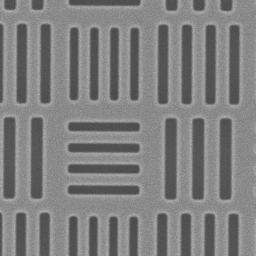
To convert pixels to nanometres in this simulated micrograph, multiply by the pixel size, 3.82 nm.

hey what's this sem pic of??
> groups of lines, slits or small figures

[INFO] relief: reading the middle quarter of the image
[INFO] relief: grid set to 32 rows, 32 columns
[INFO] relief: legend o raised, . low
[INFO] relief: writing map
o...oo...oo...oo...oooo...ooo...
o...oo...oo...oo...oooo...ooo...
o...oo...oo...oo...oooo...ooo...
o...oo...oo...oo...oooo...ooo...
o...oo...oo...oo...oooo...ooo...
o...oo...oo...oo...oooo...ooo...
o...oo...oo...oo...oooo...ooo...
o...oo...oo...oo...oooo...ooo...
o...oo..ooo...oo...oooo...ooo...
ooooooooooooooooooooooo...ooo...
oooooooooooooooooooooooooooooooo
oooooooooooooooooooooooooooooooo
oooooooooooooooooooooooooooooooo
oooooooooooooooooooooooooo..oooo
oo.oooooooooooooooooooooo...oooo
o..................oooooo...oooo
o..................oooooo...oooo
ooooooooooooooooooooooooo...oooo
ooooooooooooooooooooooooo...oooo
ooooooooooooooooooooooooo...oooo
o..................oooooo...oooo
o..................oooooo...oooo
ooooooooooooooooooooooooo...oooo
ooooooooooooooooooooooooo...oooo
ooooooooooooooooooooooooo...oooo
o..................oooooo...oooo
o..................oooooo...oooo
ooooooooooooo.....ooooooo...oooo
ooooooooooooooooooooooooo...oooo
ooooooooooooooooooooooooo...oooo
o.................ooooooo...oooo
o..................oooooo...oooo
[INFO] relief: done